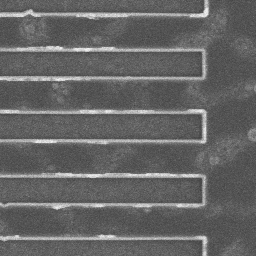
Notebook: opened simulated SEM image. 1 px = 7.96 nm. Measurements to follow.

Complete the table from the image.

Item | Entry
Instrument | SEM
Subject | one or a few lines or trenches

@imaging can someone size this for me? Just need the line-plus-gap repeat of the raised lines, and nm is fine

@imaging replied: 502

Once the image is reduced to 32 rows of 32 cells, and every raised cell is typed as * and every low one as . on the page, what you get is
..........................******
...*.....................*******
********************************
********************************
********************************
********************************
.........................*******
.........................*******
.........................*******
.........................*******
********************************
********************************
********************************
********************************
.........................*******
.........................*******
.........................*******
.........................*******
********************************
********************************
********************************
********************************
.........................*******
.........................*******
.........................*******
......................**********
********************************
********************************
********************************
********************************
.........................*******
.........................*******